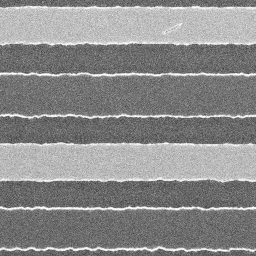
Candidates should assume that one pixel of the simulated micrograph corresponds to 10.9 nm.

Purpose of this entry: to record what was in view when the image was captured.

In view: lines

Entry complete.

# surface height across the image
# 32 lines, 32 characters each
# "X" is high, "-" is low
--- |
--------------------------------
XXXXXXXXXXXXXXXXXXXXXXXXXXXXXXXX
XXXXXXXXXXXXXXXXXXXXXXXXXXXXXXXX
XXXXXXXXXXXXXXXXXXXXXXXXXXXXXXXX
XXXXXXXXXXXXXXXXXXXXXXXXXXXXXXXX
------X-X----X--------XX--------
--------------------------------
--------------------------------
--------------------------------
XXXXXXXXXXXXXXXXXXXXXXXXXXXXXXXX
XXXXXXXXXXXXXXXXXXXXXXXXXXXXXXXX
XXXXXXXXXXXXXXXXXXXXXXXXXXXXXXXX
XXXXXXXXXXXXXXXXXXXXXXXXXXXXXXXX
XXXXXXXXXXXXXXXXXXXXXXXXXXXXXXXX
--XXXXXX-XXXXXXXXXXXXXXXXXXXXXXX
--------------------------------
--------------------------------
--------------------------------
XXXXXXXXXXXXXXXXXXXXXXXXXXXXXXXX
XXXXXXXXXXXXXXXXXXXXXXXXXXXXXXXX
XXXXXXXXXXXXXXXXXXXXXXXXXXXXXXXX
XXXXXXXXXXXXXXXXXXXXXXXXXXXXXXXX
XXXXXXXXXXXXXXXXXXXXXXXXX--XX-XX
--------------------------------
--------------------------------
--------------------------------
XXXXXXXXXXXXXXXXXXXXXXXXXXXXXXXX
XXXXXXXXXXXXXXXXXXXXXXXXXXXXXXXX
XXXXXXXXXXXXXXXXXXXXXXXXXXXXXXXX
XXXXXXXXXXXXXXXXXXXXXXXXXXXXXXXX
XXXXXXXXXXXXXXXXXXXXXXXXXXXXXXXX
--------------------------------